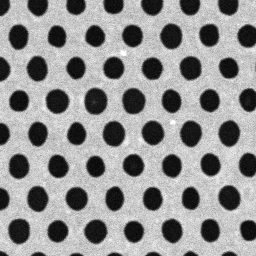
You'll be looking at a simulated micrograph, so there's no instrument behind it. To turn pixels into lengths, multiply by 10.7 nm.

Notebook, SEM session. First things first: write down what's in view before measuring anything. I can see a regular array of holes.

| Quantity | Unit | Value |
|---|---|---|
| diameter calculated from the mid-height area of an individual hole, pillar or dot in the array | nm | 242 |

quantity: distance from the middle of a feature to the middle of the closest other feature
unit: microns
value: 0.396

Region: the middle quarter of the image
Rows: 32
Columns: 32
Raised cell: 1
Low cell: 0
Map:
00000111110000011110000001111000
00000111110000011110000001111000
10000111110000011111000001111000
11001111111000111111100011111100
11111111111111111111111111111111
11111111111111111111111111111111
11111100001111110001111111011111
01111000000111100000111110000111
01111000000111000000111100000111
01111000000111000000011100000111
01111000000111100000111110000111
01111000001111100000111110000111
11111100011111110011111111111111
11111111111111111111111111111111
11001111111000111111100011111100
11000111110000011111000001111000
10000111110000011110000001111000
10000011110000001110000001111000
10000111110000011111000001111000
10000111110000011111000011111000
11111111111000111111110111111100
11111111111111111111111111111111
11111111111111111111111111001111
11111100011111110001111110000111
01111100001111100000111110000011
01111000001111100000111100000011
01111100001111100000111110000111
01111100001111110001111110000111
11111111111111111111111111101111
11111111111111111111111111111111
11111111111111111111111111111111
10000111111000111111000011111100